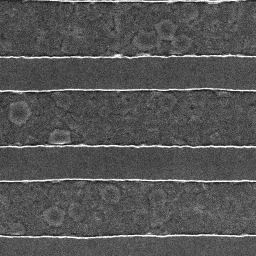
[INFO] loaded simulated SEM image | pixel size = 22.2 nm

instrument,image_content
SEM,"one or a few lines or trenches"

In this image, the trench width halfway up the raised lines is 1230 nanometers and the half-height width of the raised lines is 752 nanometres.